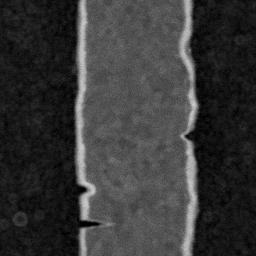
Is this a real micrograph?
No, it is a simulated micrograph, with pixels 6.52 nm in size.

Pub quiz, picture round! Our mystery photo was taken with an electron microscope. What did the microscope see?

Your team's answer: one or a few lines or trenches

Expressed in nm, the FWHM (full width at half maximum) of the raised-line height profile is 706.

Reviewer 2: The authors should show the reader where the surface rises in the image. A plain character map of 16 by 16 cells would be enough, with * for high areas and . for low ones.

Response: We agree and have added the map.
.....*******....
.....*******....
.....*******....
.....*******....
.....*******....
.....*******....
.....*******....
.....*******....
.....*******....
.....*******....
.....*******....
.....*******....
.....*******....
.....*******....
.....*******....
.....*******....